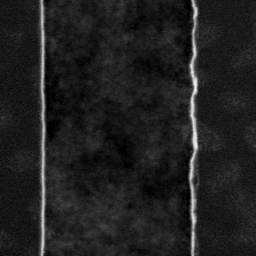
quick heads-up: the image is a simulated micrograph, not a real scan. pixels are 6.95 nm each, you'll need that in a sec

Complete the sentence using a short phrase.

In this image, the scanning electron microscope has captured one or a few lines or trenches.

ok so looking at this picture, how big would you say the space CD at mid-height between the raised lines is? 1040 nm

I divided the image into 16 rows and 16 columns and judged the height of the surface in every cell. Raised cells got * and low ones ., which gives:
***.........****
***.........****
***.........****
***.........****
***.........****
***.........****
***.........****
***.........****
***.........****
***.........****
***.........****
***.........****
***.........****
***.........****
***.........****
***.........****